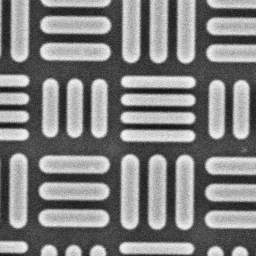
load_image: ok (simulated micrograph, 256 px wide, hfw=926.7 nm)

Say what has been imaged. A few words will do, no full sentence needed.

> groups of lines, slits or small figures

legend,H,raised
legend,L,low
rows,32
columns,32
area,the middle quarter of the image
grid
LLLLLLLLLLLLLLLLLLLLLLLLLLLLLLLL
LLLLLLLLLLLLLLLLLLLLLLLLLLLLLLLL
LLLLLLLLLLLLLLLLLLLLLLLLLLLLLLLL
LLLLLLLLLLLLLLLHHHHHHHHHHHHHHHHH
LHHHLLLHHHLLLLHHHHHHHHHHHHHHHHHH
LHHHHLLHHHHLLLLHHHHHHHHHHHHHHHHH
LHHHHLLHHHHLLLLLLLLLLLLLLLLLLLLL
LHHHHLLHHHHLLLLLLLLLLLLLLLLLLLLL
LHHHHLLHHHHLLLHHHHHHHHHHHHHHHHHH
LHHHHLLHHHHLLLHHHHHHHHHHHHHHHHHH
LHHHHLLHHHHLLLLLLLLLLLLLLLLLLLLL
LHHHHLLHHHHLLLLLLLLLLLLLLLLLLLLL
LHHHHLLHHHHLLLLHHHHHHHHHHHHHHHHH
LHHHLLLHHHHLLLHHHHHHHHHHHHHHHHHH
LHHHLLLHHHHLLLLHHHHHHHHHHHHHHHHH
LHHHLLLHHHHLLLLLLLLLLLLLLLLLLLLL
LHHHLLLHHHHLLLLLLLLLLLLLLLLLLLLL
LHHHLLLHHHLLLLHHHHHHHHHHHHHHHHHH
LLLLLLLLLLLLLLHHHHHHHHHHHHHHHHHH
LLLLLLLLLLLLLLLLLLLLLLLLLLLLLLLL
LLLLLLLLLLLLLLLLLLLLLLLLLLLLLLLL
LLLLLLLLLLLLLLLLLLLLLLLLLLLLLLLL
LLLLLLLLLLLLLLLLLLLLLLLLLLLLLLLL
HHHHHHHHHHHLLLLHHHLLLLHHHLLLLHHH
HHHHHHHHHHHLLLHHHHHLLHHHHLLLHHHH
HHHHHHHHHHHLLLHHHHHLLHHHHLLLHHHH
HHHHHHHHHHHLLLHHHHHLLHHHHLLLHHHH
LLLLLLLLLLLLLLHHHHHLLHHHHLLLHHHH
LLLLLLLLLLLLLLHHHHHLLHHHHLLLHHHH
LLLLLLLLLLLLLLHHHHHLLHHHHLLLHHHH
HHHHHHHHHHHLLLHHHHHLLHHHHLLLHHHH
HHHHHHHHHHHLLLHHHHHLLHHHHLLLHHHH